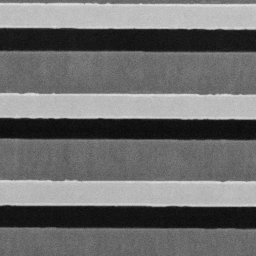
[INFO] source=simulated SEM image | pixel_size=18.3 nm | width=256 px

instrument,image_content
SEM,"lines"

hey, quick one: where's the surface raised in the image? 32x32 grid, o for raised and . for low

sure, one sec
oooooooooooooooooooooooooooooooo
oooooooooooooooooooooooooooooooo
oooooooooooooooooooooooooooooooo
......oo.ooooooooooooooooooooooo
................................
................................
................................
oooooooooooooooooooooooooooooooo
oooooooooooooooooooooooooooooooo
oooooooooooooooooooooooooooooooo
oooooooooooooooooooooooooooooooo
oooooooooooooooooooooooooooooooo
oooooooooooooooooooooooooooooooo
oooooooooooooooooooooooooooooooo
oooooooooooooooooooooooooooooooo
................................
................................
ooo.............................
oooooooooooooooooooooooooooooooo
oooooooooooooooooooooooooooooooo
oooooooooooooooooooooooooooooooo
oooooooooooooooooooooooooooooooo
oooooooooooooooooooooooooooooooo
oooooooooooooooooooooooooooooooo
oooooooooooooooooooooooooooooooo
oooooooooooooooooooooooooooooooo
................................
................................
................................
oooooooooooooooooooooooooooooooo
oooooooooooooooooooooooooooooooo
oooooooooooooooooooooooooooooooo